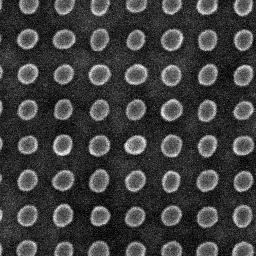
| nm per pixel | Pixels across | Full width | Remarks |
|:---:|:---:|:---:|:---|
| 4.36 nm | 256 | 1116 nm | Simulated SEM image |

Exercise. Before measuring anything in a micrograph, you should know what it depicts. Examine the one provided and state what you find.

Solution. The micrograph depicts a regular array of raised bodies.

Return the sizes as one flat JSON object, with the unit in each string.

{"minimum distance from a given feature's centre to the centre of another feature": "152 nm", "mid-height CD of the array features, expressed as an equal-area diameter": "0.0847 micrometres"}